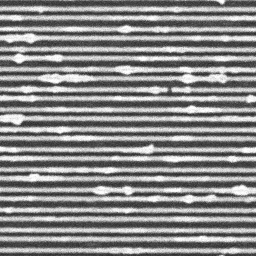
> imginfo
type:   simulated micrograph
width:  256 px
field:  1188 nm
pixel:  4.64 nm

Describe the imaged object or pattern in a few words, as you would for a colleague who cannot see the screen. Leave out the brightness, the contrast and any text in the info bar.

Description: parallel lines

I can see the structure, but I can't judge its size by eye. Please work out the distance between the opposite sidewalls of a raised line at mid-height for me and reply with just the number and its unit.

21.5 nanometres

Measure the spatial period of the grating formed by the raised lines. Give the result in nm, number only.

46.7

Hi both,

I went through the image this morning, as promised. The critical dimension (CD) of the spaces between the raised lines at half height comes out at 25.5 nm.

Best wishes